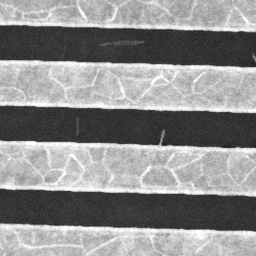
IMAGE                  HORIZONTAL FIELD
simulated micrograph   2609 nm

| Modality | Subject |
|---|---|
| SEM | lines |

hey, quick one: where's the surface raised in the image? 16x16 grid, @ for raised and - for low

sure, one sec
@@@@@@@@@@@@@@@@
@@@@@@@@@@@@@@@@
----------------
----------------
@@@@@@@@@@@@@@@@
@@@@@@@@@@@@@@@@
@@@@@@@@@@@@@@@@
----------------
----------------
@@@@@@@@@@@@@@@@
@@@@@@@@@@@@@@@@
@@@@@@@@@@@@@@@@
----------------
----------------
@@@@@@@@@@@@@@@@
@@@@@@@@@@@@@@@@